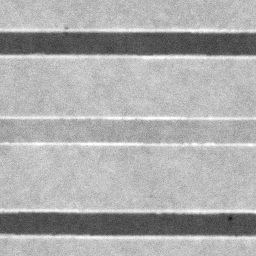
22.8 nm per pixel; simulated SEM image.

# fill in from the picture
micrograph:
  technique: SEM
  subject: lines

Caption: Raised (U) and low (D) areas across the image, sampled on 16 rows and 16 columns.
UUUUUUUUUUUUUUUU
UUUUUUUUUUUUUUUU
DDDDDDDDDDDDDDDD
DDDDDDDDDDDDDDDD
UUUUUUUUUUUUUUUU
UUUUUUUUUUUUUUUU
UUUUUUUUUUUUUUUU
UUUUUUUUUUUUUUUU
UUUUUUUUUUUUUUUU
UUUUUUUUUUUUUUUU
UUUUUUUUUUUUUUUU
UUUUUUUUUUUUUUUU
UUUUUUUUUUUUUUUU
DDDDDDDDDDDDDDDD
DDDDDDDDDDDDDDDD
UUUUUUUUUUUUUUUU